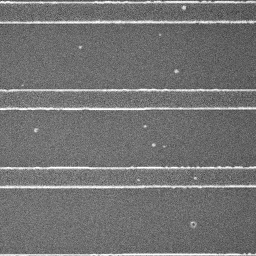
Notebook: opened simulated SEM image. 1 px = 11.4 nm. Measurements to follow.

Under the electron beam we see lines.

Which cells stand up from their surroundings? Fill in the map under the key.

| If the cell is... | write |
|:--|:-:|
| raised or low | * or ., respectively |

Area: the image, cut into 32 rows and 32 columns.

********************************
********************************
********************************
................................
................................
................................
................................
................................
................................
................................
................................
********************************
********************************
********************************
................................
................................
................................
................................
................................
................................
................................
********************************
********************************
................................
................................
................................
................................
................................
................................
................................
................................
................................